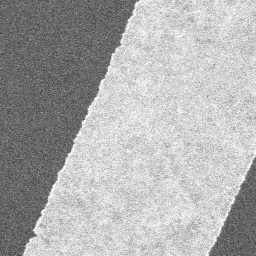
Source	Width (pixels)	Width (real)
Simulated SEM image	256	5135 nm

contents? one or a few lines or trenches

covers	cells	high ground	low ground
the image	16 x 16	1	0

0000000011111111
0000000011111111
0000000011111111
0000000111111111
0000000111111111
0000001111111111
0000001111111111
0000011111111111
0000011111111111
0000111111111111
0000111111111111
0001111111111110
0001111111111110
0001111111111100
0011111111111100
0011111111111000